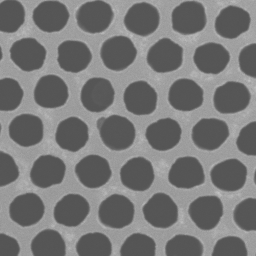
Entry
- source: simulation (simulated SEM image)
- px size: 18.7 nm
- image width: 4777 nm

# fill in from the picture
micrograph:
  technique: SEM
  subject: a regular array of holes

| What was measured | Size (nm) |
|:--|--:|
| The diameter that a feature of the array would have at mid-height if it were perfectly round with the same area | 640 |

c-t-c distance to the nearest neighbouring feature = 42.9 pixels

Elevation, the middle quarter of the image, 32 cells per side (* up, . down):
......****......*****........***
.....*******..********......****
********************************
*******...**********************
******......*****....*******....
.****.......****......*****.....
.***.........**........***......
.***.........**........***......
.***.........**........***......
****........***........***......
*****.......***........****.....
******....******......******....
*****************....***********
*...*******....**********..*****
.....*****.......******.....****
......***.........***........***
......***.........***........***
......***.........**.........***
......***.........***........***
......****.......****........***
.....******......*****......****
*...********.**********..*******
********************************
*****.....*******...********....
****.......*****.....*******....
***........****.......*****.....
***.........**........****......
***.........**.........***......
****.......***.........***......
****.......***........****......
*****.....******......******....
******************...***********